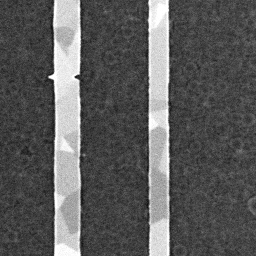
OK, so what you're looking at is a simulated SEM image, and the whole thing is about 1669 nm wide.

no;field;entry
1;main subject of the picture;one or a few lines or trenches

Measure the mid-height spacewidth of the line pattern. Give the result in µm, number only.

0.456